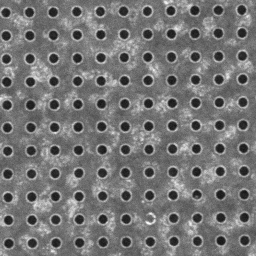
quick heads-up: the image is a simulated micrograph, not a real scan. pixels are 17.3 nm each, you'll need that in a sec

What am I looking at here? a regular array of holes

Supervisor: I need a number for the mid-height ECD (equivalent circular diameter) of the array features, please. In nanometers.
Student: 174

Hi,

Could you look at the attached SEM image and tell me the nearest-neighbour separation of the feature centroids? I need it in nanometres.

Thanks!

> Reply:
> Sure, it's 394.